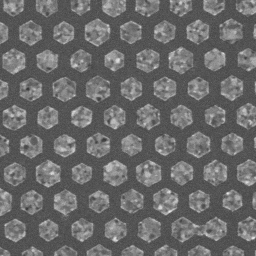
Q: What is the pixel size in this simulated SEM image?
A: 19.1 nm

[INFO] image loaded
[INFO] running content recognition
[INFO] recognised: a regular array of raised bodies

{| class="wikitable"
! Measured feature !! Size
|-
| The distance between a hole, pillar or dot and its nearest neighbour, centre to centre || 621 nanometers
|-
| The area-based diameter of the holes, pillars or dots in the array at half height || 416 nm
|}